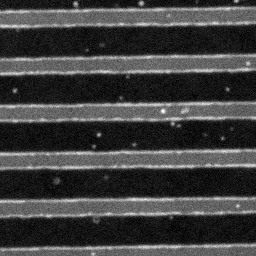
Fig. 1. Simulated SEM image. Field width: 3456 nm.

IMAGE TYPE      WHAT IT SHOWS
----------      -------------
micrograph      lines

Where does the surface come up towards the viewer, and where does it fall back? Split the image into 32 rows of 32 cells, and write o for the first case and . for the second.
oooooooooooooooooooooooooooooooo
oooo............................
................................
oooooooooooooooooooooooooooooooo
oooooooooooooooooooooooooooooooo
oooooooooooooooooooooooooooooooo
oooooooooooooooooooooooooooooooo
................................
................................
oooooooooooooooooooooooooooooooo
oooooooooooooooooooooooooooooooo
oooooooooooooooooooooooooooooooo
oooooooooooooooooooooooooooooooo
................................
................................
oooooooooooooooooooooooooooooooo
oooooooooooooooooooooooooooooooo
oooooooooooooooooooooooooooooooo
oooooooooooooooooooooooooooooooo
................................
................................
oooooooooooooooooooooooooooooooo
oooooooooooooooooooooooooooooooo
oooooooooooooooooooooooooooooooo
oooooooooooooooooooooooooooooooo
................................
..............................oo
oooooooooooooooooooooooooooooooo
oooooooooooooooooooooooooooooooo
oooooooooooooooooooooooooooooooo
oooooooooooooooooooooooooooooooo
................................